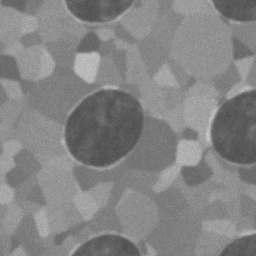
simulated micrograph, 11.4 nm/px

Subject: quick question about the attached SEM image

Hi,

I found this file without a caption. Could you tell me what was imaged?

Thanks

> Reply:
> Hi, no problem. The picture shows holes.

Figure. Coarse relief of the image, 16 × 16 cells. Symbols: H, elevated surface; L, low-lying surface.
HHHHLLLLHHHHHLLL
HHHHHHHHHHHHHHHH
HHHHHHHHHHHHHHHH
HHHHHHHHHHHHHHHH
HHHHHHHHHHHHHHHH
HHHHHHHHHHHHHHHH
HHHHHLLLLHHHHHLL
HHHHLLLLLHHHHLLL
HHHHLLLLLHHHHLLL
HHHHLLLLHHHHHLLL
HHHHHHHHHHHHHHHH
HHHHHHHHHHHHHHHH
HHHHHHHHHHHHHHHH
HHHHHHHHHHHHHHHH
HHHHHHHHHHHHHHHH
HHHHHLLLLHHHHHLL